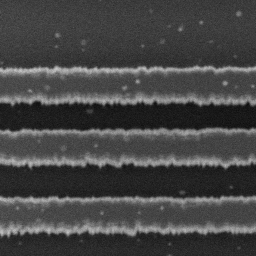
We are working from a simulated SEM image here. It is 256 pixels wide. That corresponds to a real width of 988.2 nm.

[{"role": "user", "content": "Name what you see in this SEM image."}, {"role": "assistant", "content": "lines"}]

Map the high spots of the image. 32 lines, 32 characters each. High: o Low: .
................................
................................
................................
................................
................................
................................
................................
................................
.........o.......o.o....ooo.oo.o
oooooooooooooooooooooooooooooooo
oooooooooooooooooooooooooooooooo
oooooooooooooooooooooooooooooooo
oooooooooooooooooooooooooooooooo
................................
................................
................................
oooooooooooooooooooooooooooooooo
oooooooooooooooooooooooooooooooo
oooooooooooooooooooooooooooooooo
oooooooooooooooooooooooooooooooo
.oooooooooo.o.oo.oooooooooooooo.
................................
................................
................................
................................
oooooooooooooooooooooooooooooooo
oooooooooooooooooooooooooooooooo
oooooooooooooooooooooooooooooooo
oooooooooooooooooooooooooooooooo
................................
................................
................................